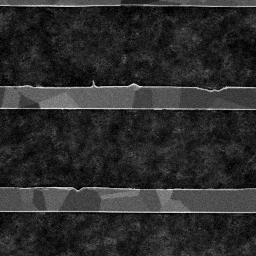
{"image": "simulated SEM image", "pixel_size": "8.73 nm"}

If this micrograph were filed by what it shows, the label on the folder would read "one or a few lines or trenches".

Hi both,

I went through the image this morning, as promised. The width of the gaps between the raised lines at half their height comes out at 702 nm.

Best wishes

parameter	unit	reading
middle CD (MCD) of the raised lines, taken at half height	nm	196